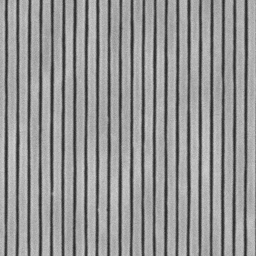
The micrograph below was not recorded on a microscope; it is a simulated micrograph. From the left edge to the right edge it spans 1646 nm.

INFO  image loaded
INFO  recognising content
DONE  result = parallel lines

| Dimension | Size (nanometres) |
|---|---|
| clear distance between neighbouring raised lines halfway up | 17.7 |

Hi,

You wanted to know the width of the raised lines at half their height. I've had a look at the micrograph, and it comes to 53 nanometers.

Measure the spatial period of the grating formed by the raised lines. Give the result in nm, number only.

73.3